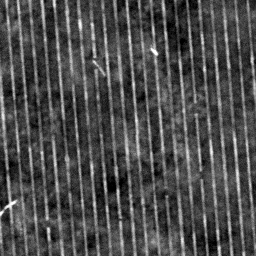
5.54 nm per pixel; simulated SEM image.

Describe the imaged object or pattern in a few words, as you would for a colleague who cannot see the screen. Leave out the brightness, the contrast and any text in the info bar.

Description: parallel lines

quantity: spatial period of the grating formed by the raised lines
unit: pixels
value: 12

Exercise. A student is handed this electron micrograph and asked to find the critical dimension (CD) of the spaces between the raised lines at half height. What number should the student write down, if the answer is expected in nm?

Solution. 52.4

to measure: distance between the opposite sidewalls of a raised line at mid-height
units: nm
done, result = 11.7